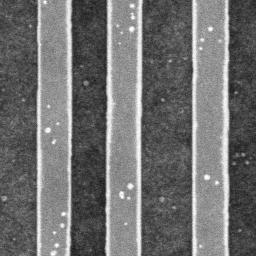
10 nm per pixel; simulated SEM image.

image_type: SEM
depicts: lines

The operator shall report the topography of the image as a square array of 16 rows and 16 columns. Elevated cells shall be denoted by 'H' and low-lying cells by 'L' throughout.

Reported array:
LLHHLLLHHLLLHHLL
LLHHLLLHHLLLHHLL
LLHHLLLHHLLLHHLL
LLHHLLLHHLLLHHLL
LLHHLLLHHLLLHHLL
LLHHLLLHHLLLHHLL
LLHHLLLHHLLLHHLL
LLHHLLLHHLLLHHLL
LLHHLLLHHLLLHHLL
LLHHLLLHHLLLHHLL
LLHHLLLHHLLLHHLL
LLHHLLLHHLLLHHLL
LLHHLLLHHLLLHHLL
LLHHLLLHHLLLHHLL
LLHHLLLHHLLLHHLL
LLHHLLLHHLLLHHLL